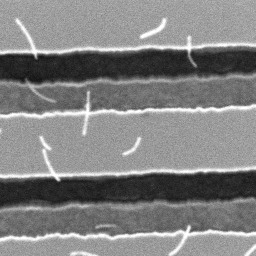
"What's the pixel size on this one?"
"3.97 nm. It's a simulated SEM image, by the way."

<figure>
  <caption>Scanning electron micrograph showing lines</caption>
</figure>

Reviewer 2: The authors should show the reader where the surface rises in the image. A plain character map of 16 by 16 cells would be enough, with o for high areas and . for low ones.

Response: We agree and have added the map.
oooooooooooooooo
oooooooooooooooo
oooooooooooooooo
................
................
oooooooooooooooo
oooooooooooooooo
oooooooooooooooo
oooooooooooooooo
oooooooooooooooo
oooooooooooooooo
................
...............o
oooooooooooooooo
oooooooooooooooo
oooooooooooooooo